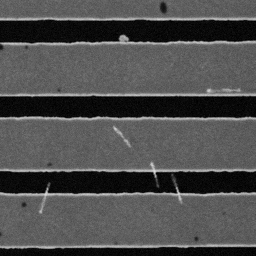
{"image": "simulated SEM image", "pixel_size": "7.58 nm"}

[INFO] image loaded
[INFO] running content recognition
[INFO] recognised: lines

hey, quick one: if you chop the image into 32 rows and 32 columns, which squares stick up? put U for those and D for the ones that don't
UUUUUUUUUUUUUUUUUUUUUUUUUUUUUUUU
UUUUUUUUUUUUUUUUUUUUUUUUUUUUUUUU
DDDDDDDDDDDDDDDDDDDDDDDDDDDDDDDD
DDDDDDDDDDDDDDDDDDDDDDDDDDDDDDDD
DDDDDDDDDDDDDDDDDDDDDDDDDDDDDDDD
UUUUUUUUUUUUUUUUUUUUUUUUUUUUUUUU
UUUUUUUUUUUUUUUUUUUUUUUUUUUUUUUU
UUUUUUUUUUUUUUUUUUUUUUUUUUUUUUUU
UUUUUUUUUUUUUUUUUUUUUUUUUUUUUUUU
UUUUUUUUUUUUUUUUUUUUUUUUUUUUUUUU
UUUUUUUUUUUUUUUUUUUUUUUUUUUUUUUU
UUUUUUUUUUUUUUUUUUUUUUUUUUUUUUUU
DDDDDDDDDDDDDDDDDDDDDDDDDDDDDDDD
DDDDDDDDDDDDDDDDDDDDDDDDDDDDDDDD
DDDDDDDDDDDDDDDDDDDDDDDDDDDDDDDD
UUUUUUUUUUUUUUUUUUUUUUUUUUUUUUUU
UUUUUUUUUUUUUUUUUUUUUUUUUUUUUUUU
UUUUUUUUUUUUUUUUUUUUUUUUUUUUUUUU
UUUUUUUUUUUUUUUUUUUUUUUUUUUUUUUU
UUUUUUUUUUUUUUUUUUUUUUUUUUUUUUUU
UUUUUUUUUUUUUUUUUUUUUUUUUUUUUUUU
DDDDDDDDDDDDDDDDDDDUDDDDDDDDDDDD
DDDDDDDDDDDDDDDDDDDDDDDDDDDDDDDD
DDDDDDDDDDDDDDDDDDDDDDDDDDDDDDDD
UUUUUUUUUUUUUUUUUUUUUUUUUUUUUUUU
UUUUUUUUUUUUUUUUUUUUUUUUUUUUUUUU
UUUUUUUUUUUUUUUUUUUUUUUUUUUUUUUU
UUUUUUUUUUUUUUUUUUUUUUUUUUUUUUUU
UUUUUUUUUUUUUUUUUUUUUUUUUUUUUUUU
UUUUUUUUUUUUUUUUUUUUUUUUUUUUUUUU
UUUUUUUUUUUUUUUUUUUUUUUUUUUUUUUU
DDDDDDDDDDDDDDDDDDDDDDDDDDDDDDDD